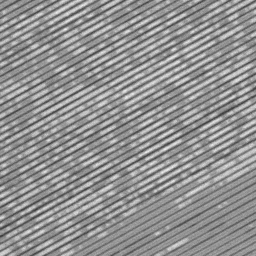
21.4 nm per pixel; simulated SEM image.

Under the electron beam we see parallel lines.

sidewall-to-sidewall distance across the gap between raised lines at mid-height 39.9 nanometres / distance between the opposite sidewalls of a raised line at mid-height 98.6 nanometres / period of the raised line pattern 0.137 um